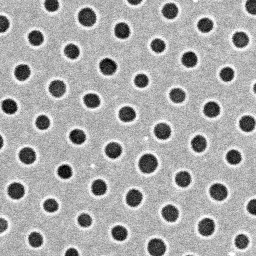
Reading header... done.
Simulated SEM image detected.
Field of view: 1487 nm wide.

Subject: a regular array of holes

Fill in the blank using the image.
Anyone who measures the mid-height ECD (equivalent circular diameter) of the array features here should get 106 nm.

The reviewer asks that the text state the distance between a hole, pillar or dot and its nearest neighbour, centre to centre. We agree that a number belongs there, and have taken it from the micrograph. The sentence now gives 213 nanometers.